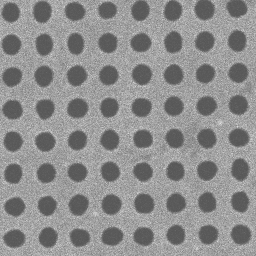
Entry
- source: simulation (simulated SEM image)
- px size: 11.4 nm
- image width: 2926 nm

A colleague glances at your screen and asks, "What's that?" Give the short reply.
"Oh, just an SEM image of a regular array of holes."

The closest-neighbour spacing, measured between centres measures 0.363 µm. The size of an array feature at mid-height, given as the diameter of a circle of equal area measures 227 nanometers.